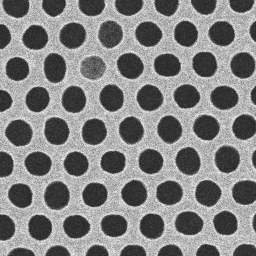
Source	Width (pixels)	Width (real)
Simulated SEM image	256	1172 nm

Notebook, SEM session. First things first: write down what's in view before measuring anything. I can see a regular array of holes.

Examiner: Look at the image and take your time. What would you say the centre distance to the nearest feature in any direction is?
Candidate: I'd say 165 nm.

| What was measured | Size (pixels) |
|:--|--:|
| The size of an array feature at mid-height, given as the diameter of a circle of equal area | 25.5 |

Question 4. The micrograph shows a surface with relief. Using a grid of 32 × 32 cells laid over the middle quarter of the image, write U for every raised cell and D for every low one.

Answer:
UUUUUUUDUUUUUDDDDDDDUUUDDDDDDUUU
UUUUUUDDDUUUUUDDDDDDUUUDDDDDDUUU
UUUUUUUUUUUUUUDDDDDUUUUUDDDDUUUU
UUUUUUUUUUUUUUUUDDUUUUUUUUUUUUUU
UUUUUUUUUUUUUUUUUUUUUUUUUUUUUUUU
UUUUUUUUUUDDDUUUUUUUDDDUUUUUUDDD
UDDDDUUUUDDDDDUUUUUDDDDDUUUUDDDD
DDDDDUUUUDDDDDDUUUDDDDDDDUUUDDDD
DDDDDDUUUDDDDDDUUUDDDDDDDUUDDDDD
DDDDDDUUUDDDDDDUUUDDDDDDDUUUDDDD
DDDDDUUUUUDDDDUUUUUDDDDDUUUUUDDD
DDDDUUUUUUUDDDUUUUUUDDDUUUUUUUUU
UUUUUUUUUUUUUUUUUUUUUUUUUUUUUUUU
UUUUUUUUUUUUUUUDDDUUUUUUDDDDUUUU
UUUUUDDDDDUUUUDDDDDUUUUUDDDDDUUU
DUUUUDDDDDUUUUDDDDDDUUUDDDDDDUUU
DUUUDDDDDDDUUUDDDDDDUUUDDDDDDDUU
DUUUDDDDDDDUUUDDDDDDUUUUDDDDDUUU
DUUUUDDDDDUUUUUDDDDUUUUUDDDDDUUU
UUUUUDDDDUUUUUUDDDUUUUUUUDDUUUUU
UUUUUUUUUUUUUUUUUUUUUUUUUUUUUUUU
UUUUUUUUUUUUUUUUUUUUUDDUUUUUUDDD
UDDDDUUUUUDDDDDUUUUDDDDDUUUUDDDD
DDDDDDUUUDDDDDDUUUUDDDDDDUUUDDDD
DDDDDDUUUDDDDDDUUUUDDDDDDUUUDDDD
DDDDDDUUUDDDDDDUUUUDDDDDDUUUDDDD
UDDDDDUUUUDDDDDUUUUDDDDDUUUUUDDD
UDDDDUUUUUUUDUUUUUUUUDDUUUUUUUUD
UUUUUUUUUUUUUUUUUUUUUUUUUUUUUUUU
UUUUUUUUUUUUUUUUDDDUUUUUUDDDUUUU
UUUUUDDDDDUUUUUDDDDDUUUDDDDDDUUU
DUUUUDDDDDDUUUDDDDDDDUUDDDDDDDUU